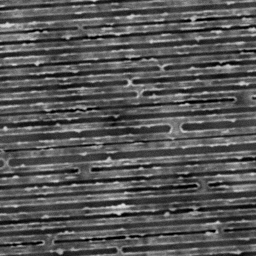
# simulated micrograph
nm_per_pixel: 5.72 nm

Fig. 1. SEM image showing parallel lines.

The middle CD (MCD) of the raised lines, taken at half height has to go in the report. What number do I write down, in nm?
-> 39.2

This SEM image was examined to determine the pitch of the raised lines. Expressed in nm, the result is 67.4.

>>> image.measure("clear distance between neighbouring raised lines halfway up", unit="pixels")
5.24